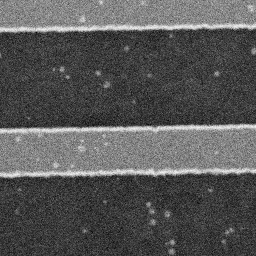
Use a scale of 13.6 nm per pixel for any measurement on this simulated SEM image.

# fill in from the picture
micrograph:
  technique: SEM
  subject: one or a few lines or trenches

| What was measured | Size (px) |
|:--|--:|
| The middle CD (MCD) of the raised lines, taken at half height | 43.9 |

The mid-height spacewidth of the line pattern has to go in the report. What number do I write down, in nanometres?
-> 1370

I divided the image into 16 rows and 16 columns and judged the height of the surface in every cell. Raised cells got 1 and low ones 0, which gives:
1111111111111111
1111111111111111
0000000000000000
0000000000000000
0000000000000000
0000000000000000
0000000000000000
0000000000000000
1111111111111111
1111111111111111
1111111111111111
0000000000000000
0000000000000000
0000000000000000
0000000000000000
0000000000000000